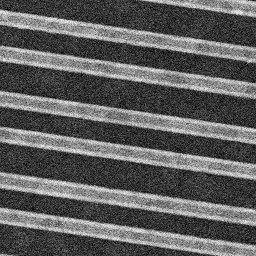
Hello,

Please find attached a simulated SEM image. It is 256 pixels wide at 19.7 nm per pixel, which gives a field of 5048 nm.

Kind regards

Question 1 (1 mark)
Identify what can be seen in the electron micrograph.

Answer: parallel lines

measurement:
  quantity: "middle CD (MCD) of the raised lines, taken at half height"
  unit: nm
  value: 239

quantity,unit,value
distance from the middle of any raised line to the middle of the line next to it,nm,778